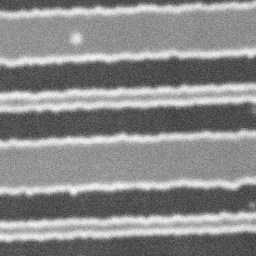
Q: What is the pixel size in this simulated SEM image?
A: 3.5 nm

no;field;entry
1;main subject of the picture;lines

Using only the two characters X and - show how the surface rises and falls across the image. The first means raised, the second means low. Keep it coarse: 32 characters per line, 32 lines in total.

-------------------------------X
----XXXXXXXXXXXXXXXXXXXXXXXXXXXX
XXXXXXXXXXXXXXXXXXXXXXXXXXXXXXXX
XXXXXXXXXXXXXXXXXXXXXXXXXXXXXXXX
XXXXXXXXXXXXXXXXXXXXXXXXXXXXXXXX
XXXXXXXXXXXXXXXXXXXXXXXXXXXXXXXX
XXXXXXXXXXXXXXXXXXXXXXXXXXXXXXXX
XXXXXXXXXX---X------------------
--------------------------------
--------------------------------
--------------------------------
--------XXXXXXXXXXXXXXXXXXXXXXXX
XXXXXXXXXXXXXXXXXXXXXXXXXXXXXXXX
XXXXXXXXX-----------------------
--------------------------------
--------------------------------
------------------------------X-
--------XXXXXXXXXXXXXXXXXXXXXXXX
XXXXXXXXXXXXXXXXXXXXXXXXXXXXXXXX
XXXXXXXXXXXXXXXXXXXXXXXXXXXXXXXX
XXXXXXXXXXXXXXXXXXXXXXXXXXXXXXXX
XXXXXXXXXXXXXXXXXXXXXXXXXXXXXXXX
XXXXXXXXXXXXXXXXXXXXXXXXXXXXXXXX
XXXXXXXXXXXXXX------------------
--------------------------------
--------------------------------
--------------------------------
--------------XXXXXXXXXXXXXXXXXX
XXXXXXXXXXXXXXXXXXXXXXXXXXXXXXXX
XXXXXXXXX---XX------------------
--------------------------------
--------------------------------